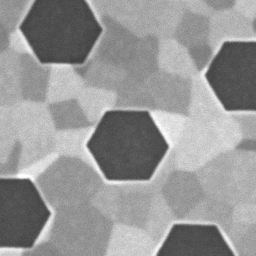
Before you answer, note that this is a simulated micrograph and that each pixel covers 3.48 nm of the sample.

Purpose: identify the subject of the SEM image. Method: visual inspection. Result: holes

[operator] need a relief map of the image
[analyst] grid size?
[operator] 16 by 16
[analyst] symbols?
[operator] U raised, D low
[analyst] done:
UUDDDDUUUUUUUUUU
UDDDDDUUUUUUUUUU
UUDDDDUUUUUUUUUU
UUDDDDUUUUUUUDDD
UUUUUUUUUUUUUDDD
UUUUUUUUUUUUUDDD
UUUUUUUUUUUUUUDD
UUUUUUDDDDUUUUUU
UUUUUUDDDDUUUUUU
UUUUUUDDDDUUUUUU
UUUUUUDDDDUUUUUU
DDUUUUUUUUUUUUUU
DDDUUUUUUUUUUUUU
DDDUUUUUUUUUUUUU
DDDUUUUUUUUDDDUU
DDUUUUUUUUDDDDUU